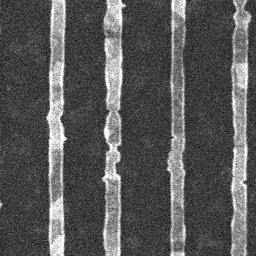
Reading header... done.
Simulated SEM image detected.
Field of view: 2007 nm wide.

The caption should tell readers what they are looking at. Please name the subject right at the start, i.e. one or a few lines or trenches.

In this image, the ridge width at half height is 93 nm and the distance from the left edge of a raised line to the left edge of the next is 478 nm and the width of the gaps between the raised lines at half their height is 393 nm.